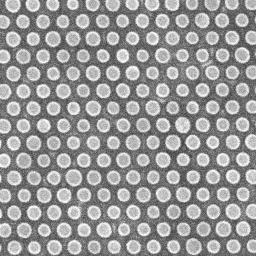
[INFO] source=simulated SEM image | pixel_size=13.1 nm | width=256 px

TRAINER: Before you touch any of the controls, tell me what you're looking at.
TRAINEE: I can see a regular array of raised bodies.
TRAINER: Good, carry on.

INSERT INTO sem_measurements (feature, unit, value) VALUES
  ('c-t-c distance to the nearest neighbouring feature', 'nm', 257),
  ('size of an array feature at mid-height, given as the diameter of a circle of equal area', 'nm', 166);